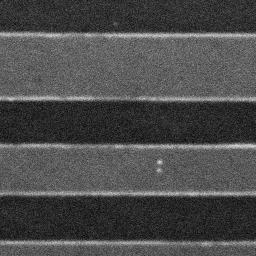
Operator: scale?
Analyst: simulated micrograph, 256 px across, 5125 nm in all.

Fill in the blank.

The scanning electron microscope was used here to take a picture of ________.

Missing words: lines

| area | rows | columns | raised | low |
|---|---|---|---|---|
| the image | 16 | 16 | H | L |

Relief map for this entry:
LLLLLLLLLLLLLLLL
LLLLLLLLLLLLLLLL
HHHHHHHHHHHHHHHH
HHHHHHHHHHHHHHHH
HHHHHHHHHHHHHHHH
HHHHHHHHHHHHHHHH
LLLLLLLLLLLLLLLL
LLLLLLLLLLLLLLLL
LLLLLLLLLLLLLLLL
HHHHHHHHHHHHHHHH
HHHHHHHHHHHHHHHH
HHHHHHHHHHHHHHHH
LLLLLLLLLLLLLLLL
LLLLLLLLLLLLLLLL
LLLLLLLLLLLLLLLL
HHHHHHHHHHHHHHHH